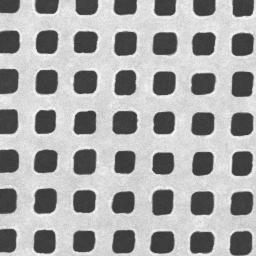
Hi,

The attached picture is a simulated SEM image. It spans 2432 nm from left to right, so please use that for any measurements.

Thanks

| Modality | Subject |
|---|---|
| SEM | a regular array of holes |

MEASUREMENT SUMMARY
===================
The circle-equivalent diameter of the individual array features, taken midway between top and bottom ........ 230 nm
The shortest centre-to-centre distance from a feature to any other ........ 0.37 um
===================